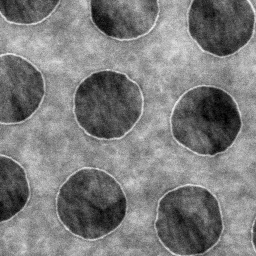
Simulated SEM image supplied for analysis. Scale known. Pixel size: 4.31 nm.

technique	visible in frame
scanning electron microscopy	raised bodies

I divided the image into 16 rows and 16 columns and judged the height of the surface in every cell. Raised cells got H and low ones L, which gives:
HHHLLLHHHHLLHHHH
LHLLLLHHHHLLHHHH
LLLLLLLLLLLLHHHH
HLLLLLLLLLLLLLLL
HHLLLLHLLLLLLLLL
HHHLLHHHHLLLHHLL
HHHLLHHHHLLHHHHL
HHLLLHHHHLLHHHHL
LLLLLLHHLLLHHHHL
LLLLLLLLLLLLHHLL
HLLLLHLLLLLLLLLL
HHLLHHHLLLLLLLLL
HHLLHHHHLLHHHHLL
HLLLHHHHLLHHHHLL
LLLLHHHLLLHHHHLL
LLLLLLLLLLHHHLLL